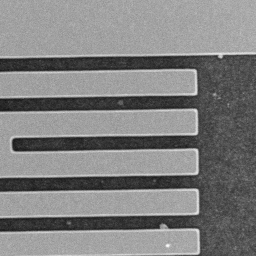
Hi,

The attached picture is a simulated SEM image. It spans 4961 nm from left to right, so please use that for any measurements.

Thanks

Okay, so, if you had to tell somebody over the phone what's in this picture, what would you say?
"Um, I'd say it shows groups of lines, slits or small figures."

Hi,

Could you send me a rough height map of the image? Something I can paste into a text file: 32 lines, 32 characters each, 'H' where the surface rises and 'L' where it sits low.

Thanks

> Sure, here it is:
HHHHHHHHHHHHHHHHHHHHHHHHHHHHHHHH
HHHHHHHHHHHHHHHHHHHHHHHHHHHHHHHH
HHHHHHHHHHHHHHHHHHHHHHHHHHHHHHHH
HHHHHHHHHHHHHHHHHHHHHHHHHHHHHHHH
HHHHHHHHHHHHHHHHHHHHHHHHHHHHHHHH
HHHHHHHHHHHHHHHHHHHHHHHHHHHHHHHH
HHHHHHHHHHHHHHHHHHHHHHHHHHHHHHHH
LLLLLLLLLLLLLLLLLLLLLLLLLLLLLLLL
LLLLLLLLLLLLLLLLLLLLLLLLLLLLLLLL
HHHHHHHHHHHHHHHHHHHHHHHHLLLLLLLL
HHHHHHHHHHHHHHHHHHHHHHHHHLLLLLLL
HHHHHHHHHHHHHHHHHHHHHHHHLLLLLLLL
LLLLLLLLLLLLLLLLLLLLLLLLLLLLLLLL
LLLLLLLLLLLLLLLLLLLLLLLLLLLLLLLL
HHHHHHHHHHHHHHHHHHHHHHHHHLLLLLLL
HHHHHHHHHHHHHHHHHHHHHHHHHLLLLLLL
HHHHHHHHHHHHHHHHHHHHHHHHHLLLLLLL
HHLLLLLLLLLLLLLLLLLLLLLLLLLLLLLL
HHLLLLLLLLLLLLLLLLLLLLLLLLLLLLLL
HHHHHHHHHHHHHHHHHHHHHHHHHLLLLLLL
HHHHHHHHHHHHHHHHHHHHHHHHHLLLLLLL
HHHHHHHHHHHHHHHHHHHHHHHHHLLLLLLL
LLLLLLLLLLLLLLLLLLLLLLLLLLLLLLLL
LLLLLLLLLLLLLLLLLLLLLLLLLLLLLLLL
HHHHHHHHHHHHHHHHHHHHHHHHHLLLLLLL
HHHHHHHHHHHHHHHHHHHHHHHHHLLLLLLL
HHHHHHHHHHHHHHHHHHHHHHHHHLLLLLLL
LLLLLLLLLLLLLLLLLLLLLLLLLLLLLLLL
LLLLLLLLLLLLLLLLLLLLLLLLLLLLLLLL
HHHHHHHHHHHHHHHHHHHHHHHHHLLLLLLL
HHHHHHHHHHHHHHHHHHHHHHHHHLLLLLLL
HHHHHHHHHHHHHHHHHHHHHHHHHLLLLLLL